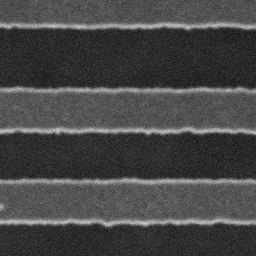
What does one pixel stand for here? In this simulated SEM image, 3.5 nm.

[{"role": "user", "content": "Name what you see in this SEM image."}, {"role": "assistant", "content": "lines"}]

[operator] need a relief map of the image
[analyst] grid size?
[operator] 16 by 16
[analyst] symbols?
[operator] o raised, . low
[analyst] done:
oooooooooooooooo
oooooooooooooooo
................
................
................
................
oooooooooooooooo
oooooooooooooooo
................
................
................
oooooooooooooooo
oooooooooooooooo
oooooooooooooooo
................
................